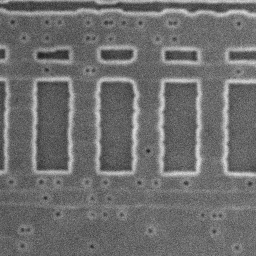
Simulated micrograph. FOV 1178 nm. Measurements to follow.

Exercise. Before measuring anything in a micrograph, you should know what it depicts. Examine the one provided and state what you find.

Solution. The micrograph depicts wiring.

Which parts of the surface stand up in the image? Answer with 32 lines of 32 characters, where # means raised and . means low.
................................
#........#######....###..##..##.
################################
################################
################################
################################
.####....####....####...#####...
#######.#####...#####...#####...
################################
################################
.####....####....###.....####...
.###.....###.....###.....###....
.###.....###.....###.....###....
.###.....###.....###.....###....
.####....###.....###.....###....
.####....###.....###.....###....
.###.....###.....###.....###....
.###.....###.....###.....###....
.###.....###.....###.....###....
.###.....###.....###.....###....
.###.....###.....###.....###....
#############...#####...#####...
################################
################################
################################
################################
################################
################################
################################
################################
################################
################################